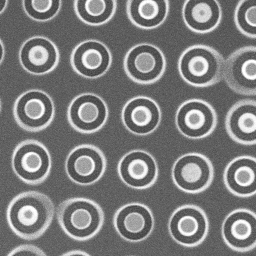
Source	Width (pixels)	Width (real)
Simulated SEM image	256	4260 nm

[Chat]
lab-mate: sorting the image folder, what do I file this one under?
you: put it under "an array of small figures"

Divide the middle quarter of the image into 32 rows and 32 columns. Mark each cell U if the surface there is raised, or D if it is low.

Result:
UUDDDDUUDDDUUUUDDDUUUUUDDUUUUDDD
UUUDDDDDDDUUUUUUDDDUUUDDDUUUUDDD
UUUUDDDDDUUUUUUUDDDDDDDDUUUUUDDD
UUUUUUUUUUUUUUUUUDDDDDDUUUUUUUDD
UUUUUUUUUUUUUUUUUUUDDUUUUUUUUUUD
UUUUUUUUUUUUUUUUUUUUUUUUUUUUUUUU
UUUUUUUUUUUUUUUUUUUUUUUUUUUUUUUU
UUUUUUUUUUUUUUUUUUUUUUUUUUUUUUUU
UUUDDDDDDUUUUUUUUUUDUUUUUUUUUUUU
UUDDDDDDDDUUUUUUDDDDDDUUUUUUUUUD
UUDDDUUUDDUUUUUDDDDDDDDUUUUUUDDD
UDDDUUUUDDDUUUUDDDUUDDDDUUUUUDDD
UDDDUUUUDDDUUUUDDUUUUDDDUUUUDDDU
UDDDUUUUDDUUUUUDDUUUUDDDUUUUDDDU
UUDDDDDDDDUUUUUDDDUUUDDDUUUUDDDU
UUDDDDDDDUUUUUUUDDDDDDDUUUUUDDDD
UUUUDDDDUUUUUUUUUDDDDDUUUUUUUDDD
UUUUUUUUUUUUUUUUUUUDUUUUUUUUUUDD
UUUUUUUUUUUUUUUUUUUUUUUUUUUUUUUU
UUUUUUUUUUUUUUUUUUUUUUUUUUUUUUUU
UUUUUDUUUUUUUUUUUUUUUUUUUUUUUUUU
UUUDDDDDUUUUUUUUUUUUUUUUUUUUUUUU
UUDDDDDDDUUUUUUUDDDDDUUUUUUUUUUU
UDDDUUDDDDUUUUUDDDDDDDUUUUUUUDDD
UDDUUUUDDDUUUUDDDDUDDDDUUUUUDDDD
UDDUUUUDDDUUUUDDDUUUDDDUUUUUDDDD
UDDUUUUDDDUUUUDDDUUUDDDUUUUDDDDU
UDDDUUDDDUUUUUDDDUUUDDDUUUUDDDDU
UUDDDDDDUUUUUUDDDDDDDDDUUUUUDDDU
UUUDDDDUUUUUUUUDDDDDDDUUUUUUDDDD
UUUUUUUUUUUUUUUUUDDDDUUUUUUUUDDD
UUUUUUUUUUUUUUUUUUUUUUUUUUUUUUDD